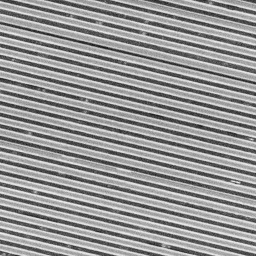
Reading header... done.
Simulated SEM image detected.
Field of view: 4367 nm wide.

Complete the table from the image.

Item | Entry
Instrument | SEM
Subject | parallel lines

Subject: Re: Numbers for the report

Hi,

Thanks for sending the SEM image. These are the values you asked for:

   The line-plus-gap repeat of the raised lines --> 192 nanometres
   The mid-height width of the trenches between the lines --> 91.3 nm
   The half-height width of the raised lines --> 0.0934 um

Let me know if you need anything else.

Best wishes